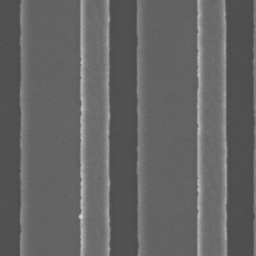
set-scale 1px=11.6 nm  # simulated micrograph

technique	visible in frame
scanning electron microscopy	lines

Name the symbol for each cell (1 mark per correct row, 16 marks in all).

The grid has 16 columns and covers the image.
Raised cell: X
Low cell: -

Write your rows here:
-XXXXXX--XXXXX--
-XXXXXX--XXXXX--
-XXXXXX--XXXXX--
-XXXXXX--XXXXX--
-XXXXXX--XXXXX--
-XXXXXX--XXXXX--
-XXXXXX--XXXXX--
-XXXXXX--XXXXX--
-XXXXXX--XXXXX--
-XXXXXX--XXXXX--
-XXXXXX--XXXXX--
-XXXXXX--XXXXX--
-XXXXXX--XXXXX--
-XXXXXX--XXXXX--
-XXXXXX--XXXXX--
-XXXXXX--XXXXX--